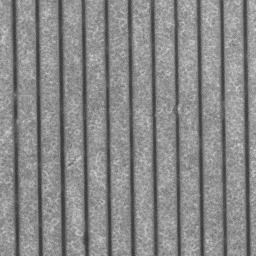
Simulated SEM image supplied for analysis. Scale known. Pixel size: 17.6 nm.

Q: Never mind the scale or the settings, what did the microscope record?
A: parallel lines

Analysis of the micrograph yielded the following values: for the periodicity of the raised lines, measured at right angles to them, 407 nanometres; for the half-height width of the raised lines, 75 nm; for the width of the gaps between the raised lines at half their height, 331 nanometres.